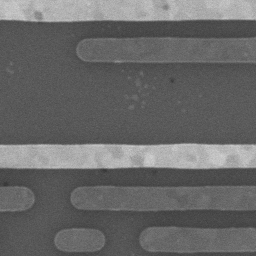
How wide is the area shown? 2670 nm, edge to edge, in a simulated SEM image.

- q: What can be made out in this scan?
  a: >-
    groups of lines, slits or small figures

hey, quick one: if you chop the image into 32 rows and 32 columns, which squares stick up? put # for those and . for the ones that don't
################################
################################
....######......................
................................
................................
..........######################
..........######################
...........#####################
................................
................................
................................
................................
................................
................................
................................
................................
................................
................................
################################
################################
################################
................................
................................
.##........####..........#######
####.....#######################
####.....#######################
................................
................................
...................####.........
.......######.....##############
.......######.....##############
................................